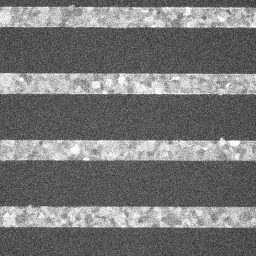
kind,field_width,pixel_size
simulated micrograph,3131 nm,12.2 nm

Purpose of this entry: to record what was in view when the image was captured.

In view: one or a few lines or trenches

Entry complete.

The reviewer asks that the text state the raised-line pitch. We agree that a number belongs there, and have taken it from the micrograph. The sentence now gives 814 nanometres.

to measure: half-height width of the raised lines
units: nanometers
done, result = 238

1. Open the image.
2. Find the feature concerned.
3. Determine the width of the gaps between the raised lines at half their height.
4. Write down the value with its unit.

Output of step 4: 572 nm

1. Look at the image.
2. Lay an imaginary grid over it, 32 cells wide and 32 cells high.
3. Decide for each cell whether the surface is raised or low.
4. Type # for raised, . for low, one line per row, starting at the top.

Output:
................................
################################
################################
................................
................................
................................
................................
................................
................................
################################
################################
################################
................................
................................
................................
................................
................................
...........................#....
################################
################################
................................
................................
................................
................................
................................
................................
################################
################################
................................
................................
................................
................................